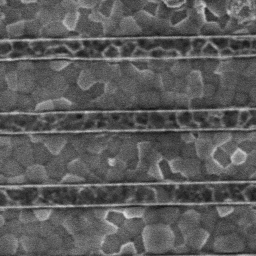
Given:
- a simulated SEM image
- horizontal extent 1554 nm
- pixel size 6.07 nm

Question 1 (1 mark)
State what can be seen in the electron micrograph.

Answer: one or a few lines or trenches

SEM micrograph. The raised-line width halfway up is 0.122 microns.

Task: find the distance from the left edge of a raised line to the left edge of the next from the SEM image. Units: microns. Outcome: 0.441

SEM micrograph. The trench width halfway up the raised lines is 321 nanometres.